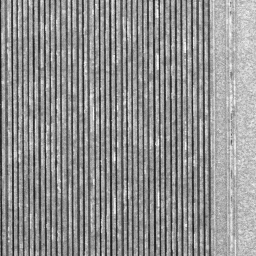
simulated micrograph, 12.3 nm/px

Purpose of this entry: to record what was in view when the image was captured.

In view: parallel lines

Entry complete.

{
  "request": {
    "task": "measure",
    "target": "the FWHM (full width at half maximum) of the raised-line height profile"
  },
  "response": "44.7 nanometres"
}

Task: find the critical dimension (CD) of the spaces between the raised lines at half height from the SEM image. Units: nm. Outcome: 23.1